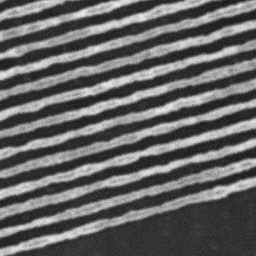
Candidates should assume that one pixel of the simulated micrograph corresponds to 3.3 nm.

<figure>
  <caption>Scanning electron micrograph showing parallel lines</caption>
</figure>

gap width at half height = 41.7 nm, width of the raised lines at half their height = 19.5 nm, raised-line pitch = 62.6 nm